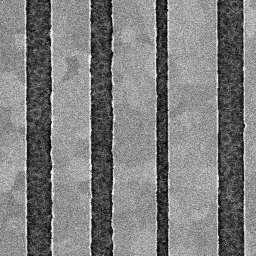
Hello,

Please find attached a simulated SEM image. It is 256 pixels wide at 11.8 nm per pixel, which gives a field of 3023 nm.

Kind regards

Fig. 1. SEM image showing one or a few lines or trenches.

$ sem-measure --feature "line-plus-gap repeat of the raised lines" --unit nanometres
719